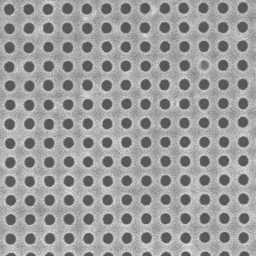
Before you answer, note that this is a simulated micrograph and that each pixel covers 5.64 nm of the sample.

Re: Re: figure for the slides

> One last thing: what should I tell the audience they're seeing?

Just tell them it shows a regular array of holes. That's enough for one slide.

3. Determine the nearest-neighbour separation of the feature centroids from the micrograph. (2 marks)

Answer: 0.107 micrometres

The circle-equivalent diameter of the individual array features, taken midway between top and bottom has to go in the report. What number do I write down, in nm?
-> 60.8